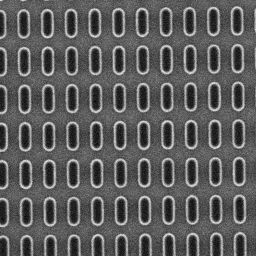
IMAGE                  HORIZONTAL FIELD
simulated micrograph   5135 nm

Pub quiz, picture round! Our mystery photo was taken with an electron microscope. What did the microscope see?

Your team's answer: groups of lines, slits or small figures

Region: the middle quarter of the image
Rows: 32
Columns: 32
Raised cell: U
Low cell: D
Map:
DUUDDDUUUDDDUUUDDDUUUDDDUUUDDDUU
DUUDDDUUUDDDUUUDDDUUUDDDUUUDDDUU
DUUDDDDUUDDDDUDDDDDDDDDDDDDDDDDD
DDDDDDDDDDDDDDDDDDDDDDDDDDDDDDDD
DDDDDDDDDDDDDDDDDDDDDDDDDDDDDDDD
DUUDDDDUUDDDDUUDDDDUUDDDDUUDDDUU
DUUDDDDUUDDDUUUDDDUUUDDDUUUDDDUU
DUUDDDDUUDDDUUUDDDUUUDDDUUUDDDUU
DUUDDDDUUDDDDUUDDDUUUDDDUUUDDDUU
DUUDDDDUUDDDDUUDDDUUUDDDUUUDDDUU
DUUDDDDUUDDDDUUDDDUUUDDDUUUDDDUU
DUUDDDDUUDDDDUUDDDDUUDDDDUUDDDDU
DDDDDDDDDDDDDDDDDDDDDDDDDDDDDDDD
DDDDDDDDDDDDDDDDDDDDDDDDDDDDDDDD
DDDDDDDDDDDDDDDDDDDDDDDDDUDDDDDU
DUUDDDDUUDDDDUUDDDDUUDDDUUUDDDUU
DUUDDDDUUDDDDUUDDDDUUDDDUUUDDDUU
DUUDDDDUUDDDDUUDDDDUUDDDUUUDDDUU
DUUDDDDUUDDDDUUDDDDUUDDDUUUDDDUU
DUUDDDDUUDDDDUUDDDDUUDDDDUUDDDUU
DUUDDDDUUDDDDUUDDDDUUDDDDUUDDDDU
DDUDDDDDDDDDDDDDDDDDDDDDDDDDDDDD
DDDDDDDDDDDDDDDDDDDDDDDDDDDDDDDD
DDDDDDDDDDDDDDDDDDDDDDDDDDDDDDDD
DUUDDDDUUDDDDUUDDDDUUDDDDUUDDDDU
DUUDDDDUUDDDDUUDDDDUUDDDDUUDDDDU
DUUUDDDUUDDDDUUDDDDUUDDDDUUDDDDU
DUUUDDDUUDDDDUUDDDDUUDDDDUUDDDDU
DUUUDDDUUDDDDUUDDDDUUDDDDUUDDDDU
DUUUDDDUUDDDDUUDDDDUUDDDDUUDDDDU
DUUDDDDUUDDDDUUDDDDUUDDDDUUDDDDU
DDDDDDDDDDDDDDDDDDDDDDDDDDDDDDDD